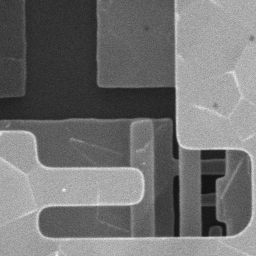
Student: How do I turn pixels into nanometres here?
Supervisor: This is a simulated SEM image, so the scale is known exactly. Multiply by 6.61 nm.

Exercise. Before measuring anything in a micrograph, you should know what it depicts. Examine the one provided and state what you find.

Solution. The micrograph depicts wiring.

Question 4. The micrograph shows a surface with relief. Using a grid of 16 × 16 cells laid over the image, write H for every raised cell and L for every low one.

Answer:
LLLLLLLLLLLHHHHH
LLLLLLLLLLLHHHHH
LLLLLLLLLLLHHHHH
LLLLLLLLLLLHHHHH
LLLLLLLLLLLHHHHH
LLLLLLLLLLLHHHHH
LLLLLLLLLLLHHHHH
LLLLLLLLLLLHHHHH
HHLLLLLLLLLHHHHH
HHLLLLLLLLLLLLLH
HHHHLLHHLLLLLLLL
HHHHHHHHHLLLLLLL
HHHHHHHHHLLLLLLL
HHLLLLLLLLLLLLLL
HHHLLLLLLLLLLLLH
HHHHHHHHHHHHHHHH